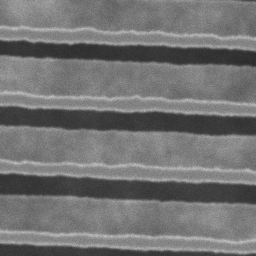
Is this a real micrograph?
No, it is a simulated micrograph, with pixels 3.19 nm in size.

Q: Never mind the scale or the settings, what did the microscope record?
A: lines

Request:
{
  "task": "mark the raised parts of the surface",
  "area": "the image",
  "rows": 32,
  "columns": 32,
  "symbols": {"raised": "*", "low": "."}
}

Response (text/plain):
********************************
********************************
********************************
********************************
********************************
..............******************
................................
************....................
********************************
********************************
********************************
********************************
********************************
...*****************************
...............................*
................................
****************................
********************************
********************************
********************************
********************************
********************************
..................**************
................................
******..........................
****************************....
********************************
********************************
********************************
********************************
..******************************
...........................*****